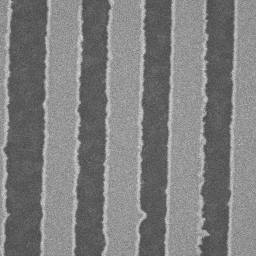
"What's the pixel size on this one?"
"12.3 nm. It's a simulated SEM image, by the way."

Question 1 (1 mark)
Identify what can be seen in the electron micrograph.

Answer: one or a few lines or trenches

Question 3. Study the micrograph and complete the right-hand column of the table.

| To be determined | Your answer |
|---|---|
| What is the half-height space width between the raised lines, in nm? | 373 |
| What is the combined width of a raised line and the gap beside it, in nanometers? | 772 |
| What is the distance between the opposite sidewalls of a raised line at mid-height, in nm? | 401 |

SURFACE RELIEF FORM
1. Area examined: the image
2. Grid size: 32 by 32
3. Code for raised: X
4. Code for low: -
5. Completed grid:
X-----XXXX----XXXX----XXXX----XX
X-----XXXX----XXXX----XXXX----XX
X-----XXXX----XXXX----XXXX---XXX
X-----XXXX----XXXX----XXXX---XXX
X-----XXXX----XXXX----XXXX---XXX
X-----XXXX----XXXX----XXXX---XXX
X-----XXXX----XXXX----XXXX---XXX
X-----XXXX----XXXX----XXXX---XXX
X-----XXXX----XXXX----XXXX---XXX
X-----XXXX---XXXXX----XXXX---XXX
X-----XXXX---XXXXX---XXXX----XXX
X-----XXXX----XXXX---XXXX----XXX
X-----XXXX----XXXX---XXXXX---XXX
X-----XXXX----XXXX---XXXXX---XXX
X-----XXXX---XXXXX---XXXXX---XXX
X-----XXXX---XXXX----XXXX----XXX
X-----XXXX----XXXX---XXXX----XXX
X-----XXXX---XXXXX---XXXX----XXX
------XXXX---XXXXX---XXXX----XXX
------XXXX---XXXX----XXXX----XXX
X-----XXXX---XXXX----XXXX----XXX
X----XXXXX---XXXX----XXXX----XXX
X-----XXX----XXXX----XXXX----XXX
------XXX----XXXX----XXXX----XXX
X----XXXX----XXXX----XXXX----XXX
X----XXXX----XXXX----XXXX----XXX
X----XXXX----XXXXX---XXXX----XXX
X----XXXX----XXXXX---XXXX----XXX
-----XXXX----XXXX----XXXX----XXX
-----XXXX----XXXX----XXXX----XXX
-----XXXX----XXXX----XXXX----XXX
-----XXXX----XXXX----XXXX----XXX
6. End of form